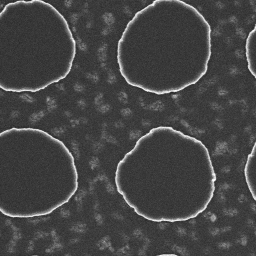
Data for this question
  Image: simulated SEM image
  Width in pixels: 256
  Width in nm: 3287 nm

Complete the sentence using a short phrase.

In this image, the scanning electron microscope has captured raised bodies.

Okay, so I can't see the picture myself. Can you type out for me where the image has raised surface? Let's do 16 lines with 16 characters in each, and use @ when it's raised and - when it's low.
@@@------@@@----
@@@@----@@@@@---
@@@@@---@@@@@--@
@@@@@--@@@@@@--@
@@@@----@@@@@---
@@@------@@-----
----------------
----------------
@@@------@@@----
@@@@----@@@@@---
@@@@@--@@@@@@--@
@@@@@--@@@@@@--@
@@@@----@@@@@---
-@-------@@@----
----------------
----------------